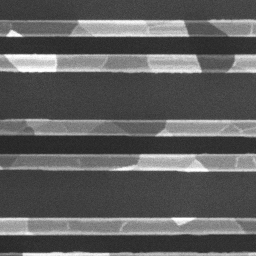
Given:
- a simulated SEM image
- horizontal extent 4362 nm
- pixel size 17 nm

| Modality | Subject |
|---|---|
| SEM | lines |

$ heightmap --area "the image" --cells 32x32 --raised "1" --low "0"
00000000000000000000000000000000
00000000000000000000000000000000
00000000000000000000000000000000
11111111111111111111111111111111
11111111111111111111111111111111
00000000000000000000000000000000
00000000000000000000000000000000
11111111111111111111111111111111
11111111111111111111111111111111
00000000000000000000000000000000
00000000000000000000000000000000
00000000000000000000000000000000
00000000000000000000000000000000
00000000000000000000000000000000
00000000000000000000000000000000
11111111111111111111111111111111
11111111111111111111111111111111
00000000000000000000000000000000
00000000000000000000000000000000
11111111111111111111111111111111
11111111111111111111111111111111
00000000000000000000000000000000
00000000000000000000000000000000
00000000000000000000000000000000
00000000000000000000000000000000
00000000000000000000000000000000
00000000000000000000000000000000
11111111111111111111111111111111
11111111111111111111111111111111
00000000000000000000000000000000
00000000000000000000000000000000
00000000000000000000000000000000